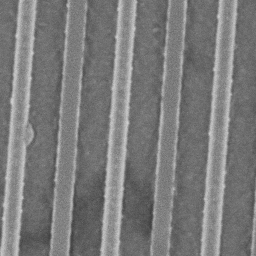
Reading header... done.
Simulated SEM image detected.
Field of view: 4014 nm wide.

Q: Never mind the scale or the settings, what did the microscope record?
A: lines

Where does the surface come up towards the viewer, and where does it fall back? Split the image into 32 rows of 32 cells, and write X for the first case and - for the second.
--XX-----XX----XX----XX-----X---
--XX----XXX----XX----XX----XX---
--XX----XXX----XX----XX----XX---
--XX----XXX----XX----XX----XX---
--XX----XXX----XX----XX----XX---
--XX----XX-----XX----XX----XX---
--XX----XX-----XX----XX----XX---
--XX----XX----XX-----XX----XX---
--XX----XX----XX-----XX----XX---
--XX----XX----XX----XXX----XX---
--XX----XX----XX----XXX----XX---
--XX----XX----XX----XX-----XX---
--XX----XX----XX----XX-----XX---
--X-----XX----XX----XX-----XX---
--X-----XX----XX----XX-----XX---
-XX----XXX----XX----XX----XX----
-XXX---XXX----XX----XX----XX----
-XXX---XXX----XX----XX----XX----
-XX----XX-----XX----XX----XX----
-XX----XX-----XX----XX----XX----
-XX----XX-----X-----XX----XX----
-XX----XX-----X-----XX----XX----
-XX----XX----XX----XXX----XX----
-XX----XX----XX----XXX----XX----
-XX----XX----XX----XXX----XX----
-XX----XX----XX----XXX----XX----
-X-----XX----XX----XX-----XX----
-X-----XX----XX----XX-----X-----
XX-----XX----XX----XX-----X-----
XX-----XX----XX----XX----XX-----
XX----XXX----XX----XX----XX-----
XX----XXX----XX----XX----XX-----